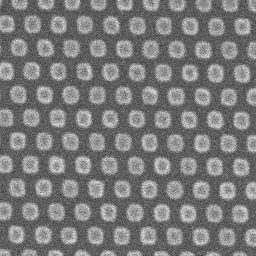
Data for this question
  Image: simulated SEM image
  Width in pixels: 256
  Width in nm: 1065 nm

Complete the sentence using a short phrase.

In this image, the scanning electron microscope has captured a regular array of raised bodies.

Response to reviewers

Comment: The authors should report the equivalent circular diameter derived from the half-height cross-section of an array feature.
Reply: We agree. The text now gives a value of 68.7 nm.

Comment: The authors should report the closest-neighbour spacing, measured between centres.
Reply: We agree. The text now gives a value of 109 nm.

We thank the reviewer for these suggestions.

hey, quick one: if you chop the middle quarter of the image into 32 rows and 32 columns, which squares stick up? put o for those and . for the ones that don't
....oo....ooo....oo.....oo....oo
...oooo...ooo....ooo...oooo...oo
...oooo...ooo....ooo...oooo...oo
....ooo...ooo....ooo...ooo....oo
................................
................................
ooo....ooo...ooo....ooo....oo...
ooo....ooo...oooo...ooo...oooo..
ooo....ooo...oooo...ooo...oooo..
.oo....ooo....oo....ooo....ooo..
................................
................................
...oooo...ooo...oooo...ooo....oo
...oooo...ooo...oooo...oooo...oo
...oooo...ooo...oooo...oooo...oo
....oo....ooo....oo.....oo....oo
................................
................................
ooo....ooo...ooo....ooo...ooo...
ooo....ooo...ooo....ooo...oooo..
ooo....ooo...oooo...ooo...oooo..
...........................oo...
................................
....oo...........o..............
...ooo....ooo...oooo...ooo...ooo
...ooo....ooo...oooo...ooo...ooo
...ooo....ooo...oooo...ooo...ooo
........................o.....oo
................................
ooo....oo....oo.....oo..........
ooo...oooo...ooo...oooo...ooo...
ooo...oooo...ooo...oooo...oooo..